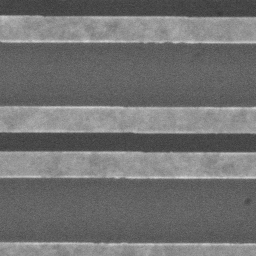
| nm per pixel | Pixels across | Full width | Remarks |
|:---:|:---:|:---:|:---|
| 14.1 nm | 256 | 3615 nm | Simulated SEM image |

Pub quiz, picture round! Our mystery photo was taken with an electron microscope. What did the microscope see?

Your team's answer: lines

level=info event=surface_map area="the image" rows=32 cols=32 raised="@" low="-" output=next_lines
--------------------------------
--------------------------------
@@@@@@@@@@@@@@@@@@@@@@@@@@@@@@@@
@@@@@@@@@@@@@@@@@@@@@@@@@@@@@@@@
@@@@@@@@@@@@@@@@@@@@@@@@@@@@@@@@
--------------------------------
--------------------------------
--------------------------------
--------------------------------
--------------------------------
--------------------------------
--------------------------------
--------------------------------
@@@@@@@@@@@@@@@-----------------
@@@@@@@@@@@@@@@@@@@@@@@@@@@@@@@@
@@@@@@@@@@@@@@@@@@@@@@@@@@@@@@@@
----------------@@@@@@@@@@@@@@@@
--------------------------------
--------------------------------
@@@@@@@@@@@@@@@@@@@@@@@@@@@@@@@@
@@@@@@@@@@@@@@@@@@@@@@@@@@@@@@@@
@@@@@@@@@@@@@@@@@@@@@@@@@@@@@@@@
--------------------------------
--------------------------------
--------------------------------
--------------------------------
--------------------------------
--------------------------------
--------------------------------
--------------------------------
@@@@@@@@@@@@---@----------------
@@@@@@@@@@@@@@@@@@@@@@@@@@@@@@@@